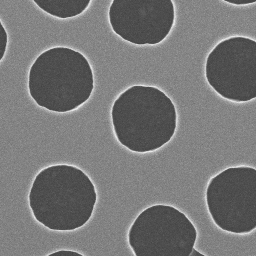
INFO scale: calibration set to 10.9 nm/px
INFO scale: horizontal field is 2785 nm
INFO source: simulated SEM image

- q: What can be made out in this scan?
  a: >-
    holes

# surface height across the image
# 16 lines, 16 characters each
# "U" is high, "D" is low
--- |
UUUDDUUDDDDUUUUU
UUUUUUUDDDDUUUUU
UUUUUUUUDDUUUUDD
UUUDDUUUUUUUUDDD
UUDDDDUUUUUUUDDD
UUDDDDUUDDUUUDDD
UUDDDUUDDDDUUUUU
UUUUUUUDDDDUUUUU
UUUUUUUDDDDUUUUU
UUUUUUUUUUUUUUUU
UUUDDUUUUUUUUUUD
UUDDDDUUUUUUUDDD
UUDDDDUUUUUUUDDD
UUDDDDUUUDDDUDDD
UUUUUUUUDDDDUUDU
UUUUUUUUDDDDUUUU